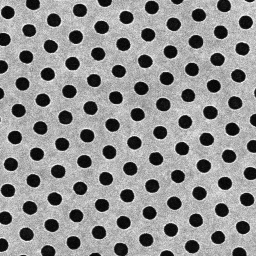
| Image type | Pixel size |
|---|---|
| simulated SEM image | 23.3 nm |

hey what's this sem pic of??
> a regular array of holes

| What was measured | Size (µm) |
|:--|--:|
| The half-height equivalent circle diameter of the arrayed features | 0.334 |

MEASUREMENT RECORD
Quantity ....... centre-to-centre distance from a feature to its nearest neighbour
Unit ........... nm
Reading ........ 619